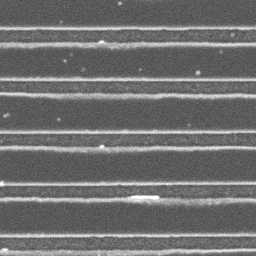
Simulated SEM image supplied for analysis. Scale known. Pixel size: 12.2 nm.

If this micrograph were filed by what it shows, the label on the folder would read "lines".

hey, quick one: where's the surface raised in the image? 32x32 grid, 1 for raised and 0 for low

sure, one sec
11111111111111111111111111111111
11111111111111111111111111111111
11111111111111111111111111111111
11111111111111111111111111111111
00000000000000000000000000000000
00000000000000000000000000000000
11111111111111111111111111111111
11111111111111111111111111111111
11111111111111111111111111111111
11111111111111111111111111111111
00000000000000000000000000000000
00000000000000000000000000000000
11111111111111111111111111111111
11111111111111111111111111111111
11111111111111111111111111111111
11111111111111111111111111111111
01110011001110110001000000000000
00000000000000000000000000000000
11111110000000000001111011111111
11111111111111111111111111111111
11111111111111111111111111111111
11111111111111111111111111111111
11111111111111111111111111111111
00000000000000000000000000000000
00000000000000000000000000000000
11111111111111111111111111111111
11111111111111111111111111111111
11111111111111111111111111111111
11111111111111111111111111111111
11111100000000000000000000000000
00000000000000000000000000000000
00000000000000000000111111111111